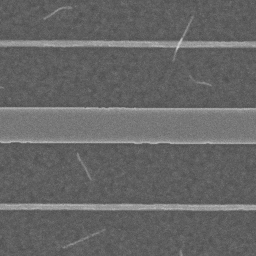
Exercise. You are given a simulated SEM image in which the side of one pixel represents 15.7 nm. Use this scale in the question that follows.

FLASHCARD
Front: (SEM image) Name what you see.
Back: lines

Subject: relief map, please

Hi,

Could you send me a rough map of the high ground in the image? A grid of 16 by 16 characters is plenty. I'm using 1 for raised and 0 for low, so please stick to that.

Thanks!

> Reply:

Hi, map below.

0000000000000000
0000000000000000
0000000000000000
0000000000000000
0000000000000000
0000000000000000
0000000000000000
1111111111111111
1111111111111111
0000000000000000
0000000000000000
0000000000000000
0000000000000000
0000000000000000
0000000000000000
0000000000000000